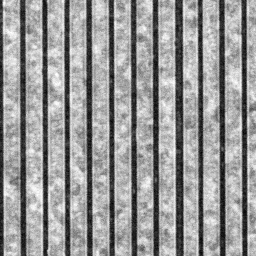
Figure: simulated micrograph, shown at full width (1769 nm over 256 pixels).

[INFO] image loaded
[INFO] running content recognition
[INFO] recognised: parallel lines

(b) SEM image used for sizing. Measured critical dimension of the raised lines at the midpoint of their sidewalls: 109 nm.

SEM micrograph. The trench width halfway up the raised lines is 7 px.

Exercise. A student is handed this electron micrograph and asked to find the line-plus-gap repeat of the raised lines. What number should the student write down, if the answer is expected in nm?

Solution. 153